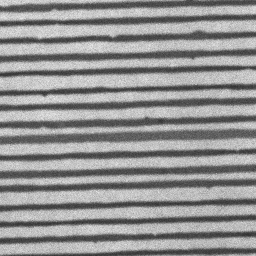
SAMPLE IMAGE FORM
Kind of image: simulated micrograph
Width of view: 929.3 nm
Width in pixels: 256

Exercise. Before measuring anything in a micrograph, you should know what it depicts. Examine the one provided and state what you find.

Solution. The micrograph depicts parallel lines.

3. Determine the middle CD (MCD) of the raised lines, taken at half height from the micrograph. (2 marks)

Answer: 0.0399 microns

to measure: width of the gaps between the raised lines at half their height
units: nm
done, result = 21.3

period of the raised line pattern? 60.4 nanometers